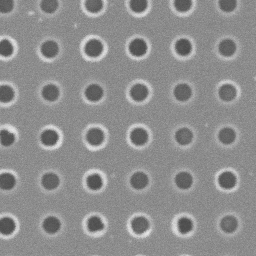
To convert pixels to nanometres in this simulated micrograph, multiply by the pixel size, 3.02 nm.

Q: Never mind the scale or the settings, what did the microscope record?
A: a regular array of holes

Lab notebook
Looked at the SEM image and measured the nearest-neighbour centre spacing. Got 132 nanometers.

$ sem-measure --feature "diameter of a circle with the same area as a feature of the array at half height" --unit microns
0.0549